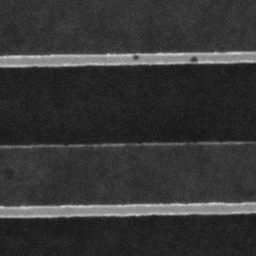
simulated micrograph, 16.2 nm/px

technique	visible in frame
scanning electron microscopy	lines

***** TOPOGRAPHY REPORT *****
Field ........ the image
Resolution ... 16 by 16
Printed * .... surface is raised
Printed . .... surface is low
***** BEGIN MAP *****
****************
****************
****************
****************
................
................
................
................
................
****************
****************
****************
****************
******..........
................
................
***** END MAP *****